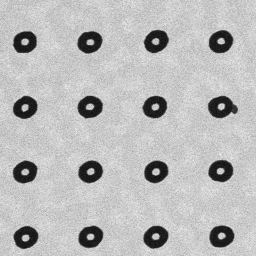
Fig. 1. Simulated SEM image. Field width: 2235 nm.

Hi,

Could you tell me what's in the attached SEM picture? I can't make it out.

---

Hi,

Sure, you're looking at a regular array of ring-shaped grooves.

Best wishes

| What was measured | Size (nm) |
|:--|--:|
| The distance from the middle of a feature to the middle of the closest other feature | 564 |